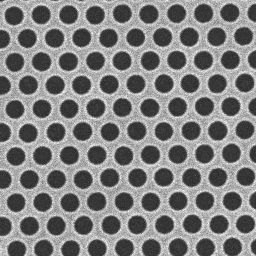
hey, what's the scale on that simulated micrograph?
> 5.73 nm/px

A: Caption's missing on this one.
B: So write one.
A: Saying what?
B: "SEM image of a regular array of holes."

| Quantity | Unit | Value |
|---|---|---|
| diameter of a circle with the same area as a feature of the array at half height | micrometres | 0.11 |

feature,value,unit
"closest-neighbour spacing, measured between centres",151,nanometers